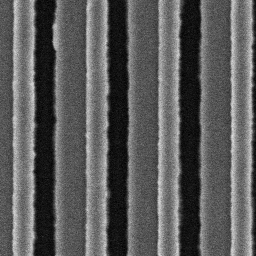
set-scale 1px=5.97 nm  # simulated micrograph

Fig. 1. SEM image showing lines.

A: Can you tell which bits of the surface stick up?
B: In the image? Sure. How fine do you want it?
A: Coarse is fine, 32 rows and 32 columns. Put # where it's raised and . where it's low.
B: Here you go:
####...######...######...######.
####...######...######...######.
####...######...######...#######
####...######...######...######.
####...######...######...#######
####...######...######...#######
####...######...######...#######
####...######...######...#######
####...######...######...#######
####...######...######...######.
####...######...######...#######
####...######...######...######.
####...######...######...######.
####...######...######...######.
####...######...######...#######
####...######...######...######.
####...######...######...#######
####...######...######...######.
####...######...######...######.
####...######...######...######.
####...######...######...######.
####...######...######...######.
####...######...######...######.
####...######...######...######.
####...######...######...######.
####...######...######...######.
####...######...######...######.
####...######...######...######.
####...######...######...######.
####...######...######...######.
####...######...######...######.
####...######...######...######.